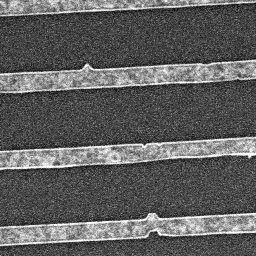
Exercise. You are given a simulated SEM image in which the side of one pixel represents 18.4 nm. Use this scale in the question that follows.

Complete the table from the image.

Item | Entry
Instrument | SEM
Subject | one or a few lines or trenches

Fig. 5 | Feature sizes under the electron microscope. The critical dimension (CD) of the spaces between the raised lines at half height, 1080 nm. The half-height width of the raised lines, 0.331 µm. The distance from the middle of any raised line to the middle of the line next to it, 1400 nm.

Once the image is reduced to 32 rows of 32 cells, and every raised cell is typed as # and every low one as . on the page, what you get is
############################....
########........................
................................
................................
................................
................................
................................
................................
..........#......###############
################################
###################.............
.#..............................
................................
................................
................................
................................
................................
...........................#####
..........######################
##########################......
#############...................
................................
................................
................................
................................
................................
................................
..................##############
################################
##################..............
##..............................
................................